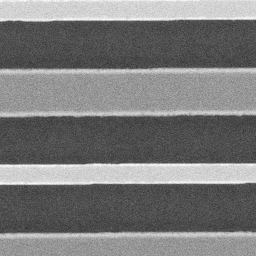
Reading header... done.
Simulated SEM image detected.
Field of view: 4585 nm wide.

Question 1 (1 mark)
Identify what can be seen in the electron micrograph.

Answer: lines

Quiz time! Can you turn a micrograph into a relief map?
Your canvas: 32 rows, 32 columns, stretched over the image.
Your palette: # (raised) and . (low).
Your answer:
################################
################################
##.####.........................
................................
................................
................................
................................
................................
................................
################################
################################
################################
################################
################################
####............................
................................
................................
................................
................................
................................
................................
################################
################################
................................
................................
................................
................................
................................
................................
################################
################################
################################